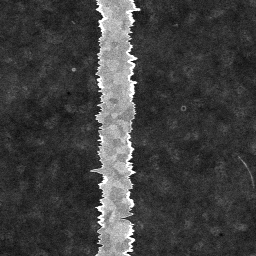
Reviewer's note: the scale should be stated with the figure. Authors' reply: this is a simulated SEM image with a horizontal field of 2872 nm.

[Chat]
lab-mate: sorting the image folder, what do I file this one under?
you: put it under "one or a few lines or trenches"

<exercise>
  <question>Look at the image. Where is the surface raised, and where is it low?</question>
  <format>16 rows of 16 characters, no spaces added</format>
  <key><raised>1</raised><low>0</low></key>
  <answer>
0000001100000000
0000001100000000
0000001100000000
0000001100000000
0000001100000000
0000001100000000
0000001100000000
0000001100000000
0000001100000000
0000001100000000
0000001100000000
0000001100000000
0000001100000000
0000001100000000
0000001100000000
0000001100000000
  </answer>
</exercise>